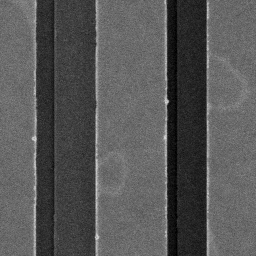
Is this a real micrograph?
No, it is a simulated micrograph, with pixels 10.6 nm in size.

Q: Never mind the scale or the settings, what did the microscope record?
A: lines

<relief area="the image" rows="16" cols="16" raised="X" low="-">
XX----XXXX---XXX
XX----XXXX---XXX
XX----XXXX---XXX
XX----XXXX---XXX
XX----XXXX---XXX
XX----XXXX---XXX
XX----XXXX---XXX
XX----XXXX---XXX
XX----XXXX---XXX
XX----XXXX---XXX
XX----XXXX---XXX
XX----XXXX---XXX
XX----XXXX---XXX
XX----XXXX---XXX
XX----XXXX---XXX
XX----XXXX---XXX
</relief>